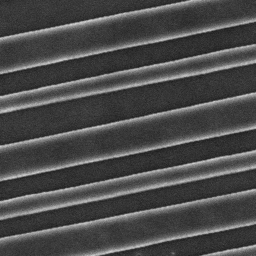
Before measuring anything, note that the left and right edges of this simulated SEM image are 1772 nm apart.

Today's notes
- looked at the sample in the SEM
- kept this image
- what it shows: lines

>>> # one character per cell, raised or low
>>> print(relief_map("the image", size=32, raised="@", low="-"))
----------------------@@@@@@@@@@
-----------------@@@@@@@@@@@@@@@
------------@@@@@@@@@@@@@@@@@@@@
------@@@@@@@@@@@@@@@@@@@@@@----
-@@@@@@@@@@@@@@@@@@@@@@---------
@@@@@@@@@@@@@@@@@@--------------
@@@@@@@@@@@@@--------------@@@@@
@@@@@@@@--------------@@@@@@@@@@
@@@--------------@@@@@@@@@@@----
------------@@@@@@@@@@@---------
-------@@@@@@@@@@@--------------
---@@@@@@@@@@-------------------
@@@@@@@@--------------------@@@@
@@@--------------------@@@@@@@@@
------------------@@@@@@@@@@@@@@
--------------@@@@@@@@@@@@@@@@@@
---------@@@@@@@@@@@@@@@@@@@@@--
----@@@@@@@@@@@@@@@@@@@@@-------
@@@@@@@@@@@@@@@@@@@@------------
@@@@@@@@@@@@@@@-------------@@@@
@@@@@@@@@@-------------@@@@@@@@@
@@@@@-------------@@@@@@@@@@@---
@------------@@@@@@@@@@@--------
---------@@@@@@@@@@-------------
---@@@@@@@@@@@-------------@@@@@
@@@@@@@@@-------------@@@@@@@@@@
@@@@@------------@@@@@@@@@@@@@@@
------------@@@@@@@@@@@@@@@@@@@@
-------@@@@@@@@@@@@@@@@@@@@@@---
--@@@@@@@@@@@@@@@@@@@@@@--------
@@@@@@@@@@@@@@@@@@@-------------
@@@@@@@@@@@@@@--------------@@@@